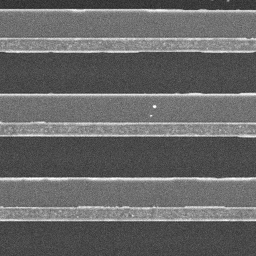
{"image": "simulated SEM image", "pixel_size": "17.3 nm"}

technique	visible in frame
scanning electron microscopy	lines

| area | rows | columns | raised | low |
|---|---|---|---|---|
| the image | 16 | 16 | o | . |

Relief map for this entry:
................
oooooooooooooooo
oooooooooooooooo
................
................
................
oooooooooooooooo
oooooooooooooooo
................
................
................
oooooooooooooooo
oooooooooooooooo
oooooooooooooooo
................
................